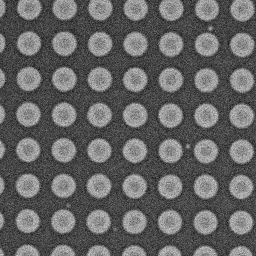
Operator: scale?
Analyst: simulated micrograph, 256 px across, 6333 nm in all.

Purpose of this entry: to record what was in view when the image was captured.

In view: an array of small figures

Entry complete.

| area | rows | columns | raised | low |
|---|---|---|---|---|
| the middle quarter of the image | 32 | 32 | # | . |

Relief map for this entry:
................................
##.....####.....####.....###....
###...######...#####....#####...
###...######...######...######..
###...######...######...######..
###...#####....#####....#####...
#.......##......###......###....
................................
................................
................................
##.....####.....####.....###....
###...######...#####....#####...
###...######...######...#####...
###...######...######...#####...
##....#####....#####....#####...
#.......##......###......###....
................................
................................
................................
##.....####.....####.....###....
###...######...#####....#####...
###...######...######...#####...
###...######...######...#####...
##.....####....#####....#####...
#.......##.......##.......##....
................................
................................
................................
##.....####.....####....#####...
###...######...#####....#####...
###...######...######...#####...
###...######...#####....#####...